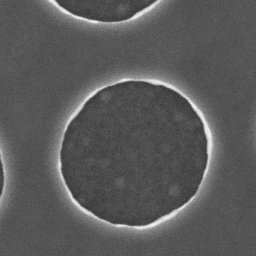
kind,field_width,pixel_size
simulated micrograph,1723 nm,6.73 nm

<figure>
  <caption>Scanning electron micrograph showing holes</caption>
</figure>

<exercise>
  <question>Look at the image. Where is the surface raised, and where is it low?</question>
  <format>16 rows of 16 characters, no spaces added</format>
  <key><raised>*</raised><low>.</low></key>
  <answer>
****.....*******
****************
****************
****************
****************
******.....*****
*****.......****
****.........***
****.........***
****.........***
****.........***
****.........***
*****.......****
******....******
****************
****************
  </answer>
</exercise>